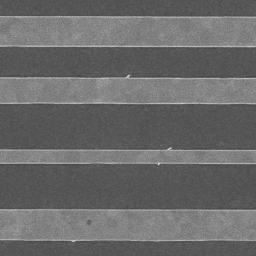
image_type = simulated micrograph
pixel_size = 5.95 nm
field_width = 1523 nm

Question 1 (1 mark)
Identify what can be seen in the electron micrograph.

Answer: one or a few lines or trenches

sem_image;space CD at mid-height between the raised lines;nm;275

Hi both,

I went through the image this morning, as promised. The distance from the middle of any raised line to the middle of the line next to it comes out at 384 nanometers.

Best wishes